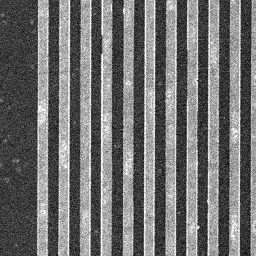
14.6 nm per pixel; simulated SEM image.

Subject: parallel lines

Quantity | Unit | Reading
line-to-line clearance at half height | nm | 175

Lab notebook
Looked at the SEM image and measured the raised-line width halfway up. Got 138 nanometres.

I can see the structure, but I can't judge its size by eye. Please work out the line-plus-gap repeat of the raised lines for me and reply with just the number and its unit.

310 nanometers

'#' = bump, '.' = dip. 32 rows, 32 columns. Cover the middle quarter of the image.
#...##....##...##....##...##...#
#...##....##...##....##...##...#
#...##....##...##...###...##...#
#...##....##...##...###...##...#
#...##....##...##...###...##...#
#...##....##...##...###...##...#
#...##....##...##...###...##...#
#...##....##...##...###...##...#
#...##....##...##...###...##...#
#...##....##...##...###...##...#
#...##....##...##...###...##...#
#...##....##...##...###...##...#
#...##....##...##...###...##...#
#...##....##...##...###...##...#
#...##....##...##...###...##...#
#...##....##...##...###...##...#
#...##....##...##...###...##...#
#...##....##...##...###...##...#
#...##....##...##...###...##...#
#...##....##...##...###...##...#
#...##....##...##...###...##...#
#...##....##...##...###...##...#
#...##....##...##...###...##...#
#...##....##...##...###...##...#
#...##....##...##...###...##...#
#...##....##...##...###...##...#
#...##....##...##...###...##...#
#...##....##...##...###...##...#
#...##....##...##...###...##...#
#...##....##...##...###...##...#
#...##....##...##...###...##...#
#...##....##...##...###...##...#